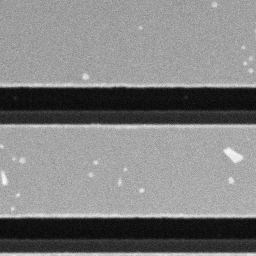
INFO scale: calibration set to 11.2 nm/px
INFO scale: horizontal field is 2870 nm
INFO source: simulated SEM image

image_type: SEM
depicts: lines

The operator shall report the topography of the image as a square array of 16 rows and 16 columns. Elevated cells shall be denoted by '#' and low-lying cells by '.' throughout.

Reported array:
################
################
################
################
################
................
................
................
################
################
################
################
################
################
................
................